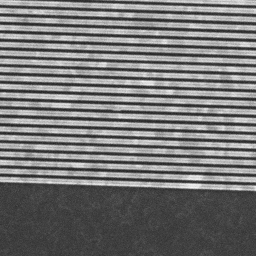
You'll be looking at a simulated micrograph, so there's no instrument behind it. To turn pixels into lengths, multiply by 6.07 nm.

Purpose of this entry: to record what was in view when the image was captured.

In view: parallel lines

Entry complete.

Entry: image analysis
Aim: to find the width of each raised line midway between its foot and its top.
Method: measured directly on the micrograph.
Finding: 21.2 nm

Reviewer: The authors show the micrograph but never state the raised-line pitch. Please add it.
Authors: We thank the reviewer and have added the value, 51.1 nm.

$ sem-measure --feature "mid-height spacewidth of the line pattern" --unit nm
26.5